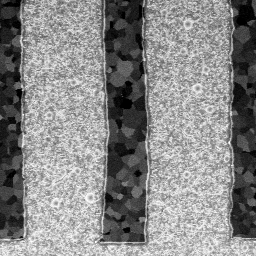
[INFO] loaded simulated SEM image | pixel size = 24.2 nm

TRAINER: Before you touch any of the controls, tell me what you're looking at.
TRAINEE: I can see one or a few lines or trenches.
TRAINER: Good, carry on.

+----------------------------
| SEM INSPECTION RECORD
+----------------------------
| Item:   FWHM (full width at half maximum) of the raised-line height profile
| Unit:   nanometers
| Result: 983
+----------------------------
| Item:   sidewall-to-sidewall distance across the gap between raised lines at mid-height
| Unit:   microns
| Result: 2.01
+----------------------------